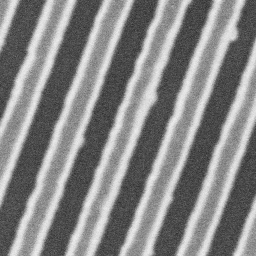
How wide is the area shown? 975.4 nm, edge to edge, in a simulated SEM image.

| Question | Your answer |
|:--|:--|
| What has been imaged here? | lines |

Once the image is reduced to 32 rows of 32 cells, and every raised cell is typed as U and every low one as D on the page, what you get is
UUDDDDUUUDDDDUUUDDDDUUUDDDDUUUDD
UUDDDUUUUDDDUUUUDDDDUUUDDDUUUUDD
UDDDDUUUDDDDUUUUDDDUUUUDDDUUUUDD
UDDDDUUUDDDDUUUDDDDUUUDDDDUUUDDD
UDDDUUUUDDDUUUUDDDUUUUDDDUUUUDDD
DDDDUUUDDDDUUUDDDDUUUDDDDUUUDDDD
DDDDUUUDDDDUUUDDDDUUUDDDUUUUDDDD
DDDUUUUDDDUUUUDDDUUUUDDDUUUUDDDU
DDDUUUDDDDUUUDDDDUUUDDDDUUUDDDDU
DDUUUUDDDDUUUDDDDUUUDDDUUUUDDDUU
DDUUUDDDDUUUUDDDUUUUDDDUUUUDDDUU
DDUUUDDDDUUUDDDDUUUDDDDUUUDDDDUU
DUUUUDDDUUUUDDDDUUUDDDUUUUDDDDUU
DUUUDDDDUUUDDDDUUUDDDDUUUDDDDUUU
DUUUDDDDUUUDDDDUUUDDDDUUUDDDDUUU
UUUUDDDUUUUDDDDUUUDDDUUUUDDDUUUU
UUUDDDDUUUDDDDUUUDDDDUUUDDDDUUUD
UUUDDDDUUUDDDDUUUDDDDUUUDDDDUUUD
UUDDDDUUUUDDDUUUUDDDUUUUDDDUUUUD
UUDDDDUUUDDDDUUUDDDDUUUDDDDUUUDD
UUDDDUUUUDDDDUUUDDDUUUUDDDUUUUDD
UDDDDUUUUDDDUUUDDDDUUUDDDDUUUDDD
UDDDDUUUDDDDUUUDDDDUUUDDDDUUUDDD
UDDDDUUUDDDUUUUDDDUUUUDDDUUUUDDD
DDDDUUUDDDDUUUDDDDUUUDDDDUUUDDDD
DDDDUUUDDDDUUUDDDDUUUDDDDUUUDDDD
DDDUUUUDDDUUUDDDDUUUUDDDUUUUDDDU
DDDUUUDDDDUUUDDDDUUUDDDDUUUDDDDU
DDUUUUDDDDUUUDDDUUUUDDDUUUUDDDDU
DDUUUUDDDUUUDDDDUUUDDDDUUUDDDDUU
DDUUUDDDDUUUDDDDUUUDDDDUUUDDDDUU
DUUUUDDDUUUUDDDUUUUDDDUUUUDDDDUU